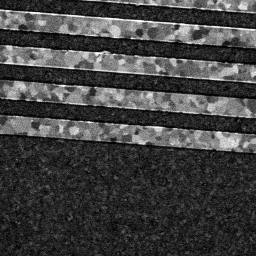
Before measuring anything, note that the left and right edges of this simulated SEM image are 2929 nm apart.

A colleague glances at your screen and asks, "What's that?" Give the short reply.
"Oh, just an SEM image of parallel lines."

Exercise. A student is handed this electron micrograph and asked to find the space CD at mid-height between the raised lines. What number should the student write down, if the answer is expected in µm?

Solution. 0.201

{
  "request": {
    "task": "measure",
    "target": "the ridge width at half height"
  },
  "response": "201 nm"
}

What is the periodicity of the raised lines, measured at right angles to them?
399 nm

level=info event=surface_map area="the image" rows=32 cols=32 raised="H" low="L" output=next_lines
LLLLLLLLLLLLLLLLLHHHHHHHHHHHHHHH
HHLLLLLLLLLLLLLLLLLLLLLLLLLLLLLH
HHHHHHHHHHHHHHHLLLLLLLLLLLLLLLLL
HHHHHHHHHHHHHHHHHHHHHHHHHHHHLLLL
LLLLLLLLLLLLLHHHHHHHHHHHHHHHHHHH
LLLLLLLLLLLLLLLLLLLLLLLLLLHHHHHH
HHHHHHHHHHLLLLLLLLLLLLLLLLLLLLLL
HHHHHHHHHHHHHHHHHHHHHHHLLLLLLLLL
LLLLLLLLLHHHHHHHHHHHHHHHHHHHHHHH
LLLLLLLLLLLLLLLLLLLLLLHHHHHHHHHH
HHHHHHLLLLLLLLLLLLLLLLLLLLLLLLLL
HHHHHHHHHHHHHHHHHHHLLLLLLLLLLLLL
LLLLHHHHHHHHHHHHHHHHHHHHHHHHHHHH
LLLLLLLLLLLLLLLLLHHHHHHHHHHHHHHH
HLLLLLLLLLLLLLLLLLLLLLLLLLLLLLHH
HHHHHHHHHHHHHHLLLLLLLLLLLLLLLLLL
HHHHHHHHHHHHHHHHHHHHHHHHHHLLLLLL
LLLLLLLLLLLLHHHHHHHHHHHHHHHHHHHH
LLLLLLLLLLLLLLLLLLLLLLLLLHHHHHHH
LLLLLLLLLLLLLLLLLLLLLLLLLLLLLLLL
LLLLLLLLLLLLLLLLLLLLLLLLLLLLLLLL
LLLLLLLLLLLLLLLLLLLLLLLLLLLLLLLL
LLLLLLLLLLLLLLLLLLLLLLLLLLLLLLLL
LLLLLLLLLLLLLLLLLLLLLLLLLLLLLLLL
LLLLLLLLLLLLLLLLLLLLLLLLLLLLLLLL
LLLLLLLLLLLLLLLLLLLLLLLLLLLLLLLL
LLLLLLLLLLLLLLLLLLLLLLLLLLLLLLLL
LLLLLLLLLLLLLLLLLLLLLLLLLLLLLLLL
LLLLLLLLLLLLLLLLLLLLLLLLLLLLLLLL
LLLLLLLLLLLLLLLLLLLLLLLLLLLLLLLL
LLLLLLLLLLLLLLLLLLLLLLLLLLLLLLLL
LLLLLLLLLLLLLLLLLLLLLLLLLLLLLLLL